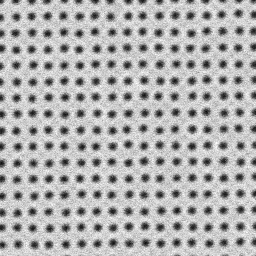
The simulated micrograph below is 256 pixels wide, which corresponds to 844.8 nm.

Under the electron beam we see a regular array of holes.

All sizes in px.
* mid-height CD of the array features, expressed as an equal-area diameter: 8.76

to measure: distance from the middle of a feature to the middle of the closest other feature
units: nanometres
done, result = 50.3